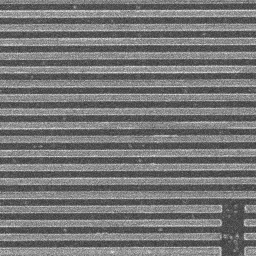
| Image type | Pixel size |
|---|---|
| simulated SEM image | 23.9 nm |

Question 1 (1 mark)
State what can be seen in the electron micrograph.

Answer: parallel lines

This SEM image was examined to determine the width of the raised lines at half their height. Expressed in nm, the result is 197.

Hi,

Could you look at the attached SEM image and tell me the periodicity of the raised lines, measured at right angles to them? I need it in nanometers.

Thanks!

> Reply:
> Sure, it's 333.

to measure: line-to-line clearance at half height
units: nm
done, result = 131